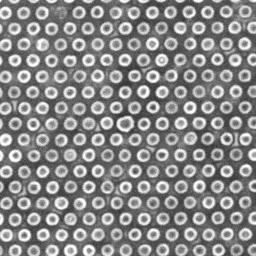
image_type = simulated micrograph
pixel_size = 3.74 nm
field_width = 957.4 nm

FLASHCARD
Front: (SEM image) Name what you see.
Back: a regular array of raised bodies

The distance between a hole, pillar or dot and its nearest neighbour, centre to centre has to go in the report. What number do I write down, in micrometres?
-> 0.0668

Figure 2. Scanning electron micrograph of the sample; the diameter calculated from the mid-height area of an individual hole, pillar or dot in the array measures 44 nm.